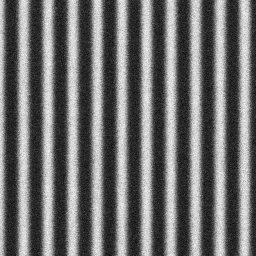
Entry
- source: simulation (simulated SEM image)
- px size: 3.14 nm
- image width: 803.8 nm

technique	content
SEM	parallel lines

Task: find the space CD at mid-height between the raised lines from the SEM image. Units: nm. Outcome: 50.2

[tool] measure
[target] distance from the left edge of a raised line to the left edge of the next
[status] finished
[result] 24.6 px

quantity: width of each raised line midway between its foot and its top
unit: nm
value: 27.8